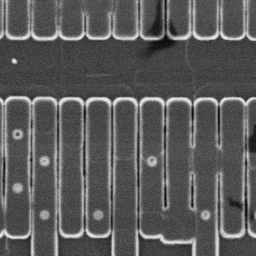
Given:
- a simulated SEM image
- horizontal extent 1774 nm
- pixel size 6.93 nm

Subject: wiring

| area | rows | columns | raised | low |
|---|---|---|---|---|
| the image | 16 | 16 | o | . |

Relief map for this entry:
oooooooooooooooo
oooooooooooooooo
................
................
................
................
oooooooooooooooo
oooooooooooooooo
oooooooooooooooo
oooooooooooooooo
oooooooooooooooo
oooooooooooooooo
oooooooooooooooo
oooooooooooooooo
oooooooooooooooo
..oo...oo...oo..